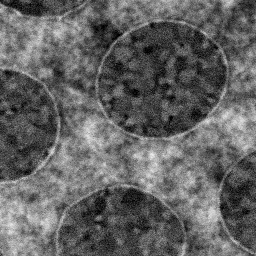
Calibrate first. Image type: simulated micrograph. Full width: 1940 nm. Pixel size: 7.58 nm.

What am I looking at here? raised bodies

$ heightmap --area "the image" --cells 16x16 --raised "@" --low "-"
-@@@@-----------
---------@@@----
-------@@@@@@---
-------@@@@@@@--
@-----@@@@@@@@--
@@@---@@@@@@@@--
@@@---@@@@@@@@--
@@@@---@@@@@@---
@@@@----@@@-----
@@@-------------
@@------------@@
--------------@@
-----@@@@@----@@
----@@@@@@@---@@
----@@@@@@@@--@@
----@@@@@@@@---@